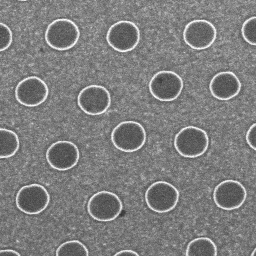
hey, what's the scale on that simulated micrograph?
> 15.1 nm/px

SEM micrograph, a regular array of raised bodies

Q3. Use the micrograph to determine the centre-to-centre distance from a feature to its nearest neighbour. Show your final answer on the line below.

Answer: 880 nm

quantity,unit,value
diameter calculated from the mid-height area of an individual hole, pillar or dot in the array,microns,0.469